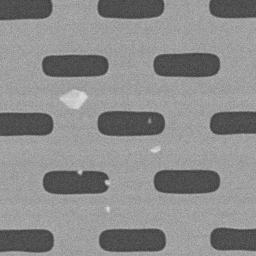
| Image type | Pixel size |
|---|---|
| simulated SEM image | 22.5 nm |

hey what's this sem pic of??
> groups of lines, slits or small figures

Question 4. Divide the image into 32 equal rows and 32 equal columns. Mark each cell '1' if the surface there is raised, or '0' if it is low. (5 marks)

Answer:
00000001111100000000011111000000
00000011111100000000111111000000
00111111111111111111111111111111
11111111111111111111111111111111
11111111111111111111111111111111
11111111111111111111111111111111
11111111111111111111111111111111
11111000000001111110000000011111
11111000000000111110000000011111
11111100000001111111000000011111
11111111111111111111111111111111
11111111111111111111111111111111
11111111111111111111111111111111
11111111111111111111111111111111
00000011111100000000111111100000
00000001111100000000011111000000
00000011111110000000111111100000
11111111111111111111111111111111
11111111111111111111111111111111
11111111111111111111111111111111
11111111111111111111111111111111
11111100000001111111000000011111
11111000000001111110000000001111
11111000000001111110000000011111
11111111111111111111111111111111
11111111111111111111111111111111
11111111111111111111111111111111
11111111111111111111111111111111
11111111111111111111111111100111
00000001111100000000011111000000
00000001111100000000011111000000
00000011111111000001111111111111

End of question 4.